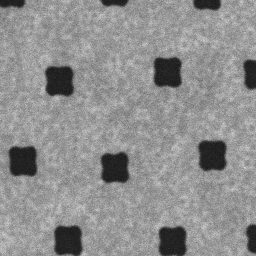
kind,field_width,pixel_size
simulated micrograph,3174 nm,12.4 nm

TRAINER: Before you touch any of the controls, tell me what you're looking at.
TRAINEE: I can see holes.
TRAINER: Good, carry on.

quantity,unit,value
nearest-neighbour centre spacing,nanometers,1140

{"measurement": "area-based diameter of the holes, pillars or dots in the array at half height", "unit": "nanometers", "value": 400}